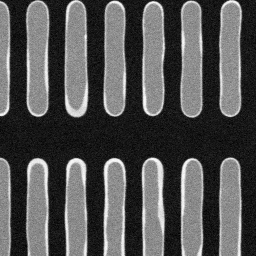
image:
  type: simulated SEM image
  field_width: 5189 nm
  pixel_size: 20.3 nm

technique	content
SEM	groups of lines, slits or small figures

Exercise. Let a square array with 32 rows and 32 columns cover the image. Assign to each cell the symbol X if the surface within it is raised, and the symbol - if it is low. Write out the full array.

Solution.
----XX---X----X----X---XX---XX--
X--XXX--XXX--XXX--XX---XX---XX--
X--XXX--XXX--XXX--XX---XX---XX--
X--XXX--XXX--XXX--XX---XX---XX--
X--XXX--XXX--XXX--XX---XX---XX--
X--XXX--XXX--XX---XX---XX---XX--
X--XXX--XXX--XXX--XX---XX---XX--
X--XXX--XXX--XXX--XX---XX---XX--
X--XXX--XXX--XXX--XX---XX---XX--
X---XX--XXX--XXX--XX---XX---XX--
X--XXX--XXX--XXX--XX---XX---XX--
X--XXX--XXX--XXX--XX---XX---XX--
X--XXX--XXX--XXX--XX---XX---XX--
X---XX---X---XXX--XX---XX---XX--
-----------------------XX---X---
--------------------------------
--------------------------------
--------------------------------
--------------------------------
--------------------------------
X---X----X---XX---XX---XX---XX--
X---XX--XX---XXX--XX---XX---XX--
X---XX--XXX--XXX--XX---XX---XX--
X--XXX--XXX--XXX--XX---XX---XX--
X--XXX--XXX--XXX--XX---XX---XX--
X--XXX--XXX--XXX--XX---XX---XX--
X--XXX--XXX--XX---XX---XX---XX--
X--XXX--XXX--XXX--XX---XX---XX--
X--XXX--XXX--XX---XX---XX---XX--
X--XXX--XXX--XX---XX---XX---XX--
X--XXX--XXX--XX---XX---XX---XX--
X---XX--XXX--XX---XX---XX---XX--